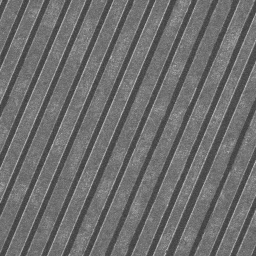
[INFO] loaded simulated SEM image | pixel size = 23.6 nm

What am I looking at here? parallel lines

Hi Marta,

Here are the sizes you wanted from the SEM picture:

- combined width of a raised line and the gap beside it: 457 nm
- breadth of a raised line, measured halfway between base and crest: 0.304 microns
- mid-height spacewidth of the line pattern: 163 nanometers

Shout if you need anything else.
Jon